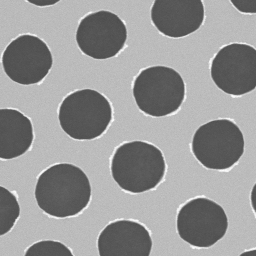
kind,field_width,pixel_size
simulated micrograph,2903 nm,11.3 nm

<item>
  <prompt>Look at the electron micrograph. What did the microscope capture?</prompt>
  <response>a regular array of holes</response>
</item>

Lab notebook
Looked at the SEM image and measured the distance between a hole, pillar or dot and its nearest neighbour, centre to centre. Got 889 nm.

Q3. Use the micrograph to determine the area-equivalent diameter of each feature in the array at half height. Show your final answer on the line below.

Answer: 50.5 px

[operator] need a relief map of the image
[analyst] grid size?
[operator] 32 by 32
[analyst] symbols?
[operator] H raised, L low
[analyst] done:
HHHHLLLHHHHHHHHHHHHLLLLLLHHHHLLL
HHHHHHHHHHHHLLHHHHHLLLLLLLHHHHLL
HHHHHHHHHHLLLLLHHHHLLLLLLHHHHHHH
HHHHHHHHHHLLLLLLHHHHLLLLLHHHHHHH
HHHLHHHHHHLLLLLLHHHHHLLHHHHHHHHH
HLLLLLHHHHLLLLLHHHHHHHHHHHHHHLHH
HLLLLLHHHHLLLLLHHHHHHHHHHHHLLLLL
LLLLLLLHHHHHHHHHHHHHHHHHHHHLLLLL
LLLLLLHHHHHHHHHHHHHLLHHHHHLLLLLL
HLLLLLHHHHHHHHHHHLLLLLHHHHLLLLLL
HHHLHHHHHHHHHHHHHLLLLLLHHHHLLLLL
HHHHHHHHHLLLHHHHHLLLLLLHHHHHLLLH
HHHHHHHHLLLLLHHHHLLLLLLHHHHHHHHH
HHHHHHHHLLLLLLHHHLLLLLHHHHHHHHHH
LLLHHHHLLLLLLLHHHHHLHHHHHHHHHHHH
LLLLHHHHLLLLLLHHHHHHHHHHHHLLLHHH
LLLLHHHHLLLLLHHHHHHHHHHHHLLLLLHH
LLLLHHHHHHHHHHHHHHHHHHHHLLLLLLHH
LLLLHHHHHHHHHHHLLLLLHHHHLLLLLLHH
LLHHHHHHHHHHHHLLLLLLHHHHLLLLLLHH
HHHHHHHLHHHHHHLLLLLLLHHHHLLLLHHH
HHHHHHLLLLHHHHLLLLLLHHHHHHHHHHHH
HHHHHLLLLLLHHHLLLLLLHHHHHHHHHHHH
LHHHLLLLLLLHHHHLLLLHHHHHHHHHHHHH
LLHHLLLLLLLHHHHHHHHHHHHHHHHHHHHL
LLHHHLLLLLLHHHHHHHHHHHHLLLLHHHHL
LLHHHHLLLLHHHHHHHHHHHHLLLLLLHHHH
LLHHHHHHHHHHHHHHHHHHHHLLLLLLHHHH
LHHHHHHHHHHHHLLLLLHHHHLLLLLLHHHH
HHHHHHHHHHHHLLLLLLLHHHHLLLLLHHHH
HHHHLLLLHHHHLLLLLLLHHHHHLLLHHHHH
HHHLLLLLLHHHLLLLLLLHHHHHHHHHHHHL